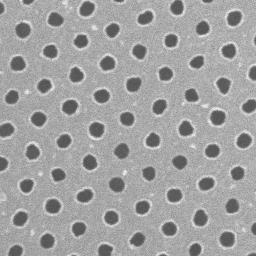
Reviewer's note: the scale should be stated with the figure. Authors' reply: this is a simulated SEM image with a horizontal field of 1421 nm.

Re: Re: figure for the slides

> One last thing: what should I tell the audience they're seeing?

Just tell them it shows a regular array of holes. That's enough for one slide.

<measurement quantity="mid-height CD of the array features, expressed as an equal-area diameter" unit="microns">0.0763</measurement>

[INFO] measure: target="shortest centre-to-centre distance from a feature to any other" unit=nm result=185